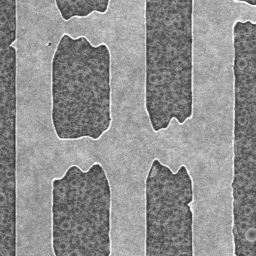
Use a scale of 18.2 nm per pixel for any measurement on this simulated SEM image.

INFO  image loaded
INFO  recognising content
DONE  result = one or a few lines or trenches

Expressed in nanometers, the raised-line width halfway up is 709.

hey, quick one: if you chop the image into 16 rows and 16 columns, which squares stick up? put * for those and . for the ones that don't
.***...**...****
.********...***.
.***.****...***.
.**....**...***.
.**....**...***.
.**....**...***.
.**....**...***.
.**....**...***.
.***..*********.
.**************.
.***.**********.
.**....**...***.
.**....**...***.
.**....**...***.
.**....**...***.
.**....**...***.